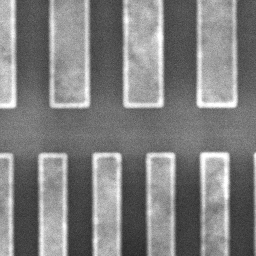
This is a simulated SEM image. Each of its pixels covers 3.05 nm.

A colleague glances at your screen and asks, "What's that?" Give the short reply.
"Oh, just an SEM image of groups of lines, slits or small figures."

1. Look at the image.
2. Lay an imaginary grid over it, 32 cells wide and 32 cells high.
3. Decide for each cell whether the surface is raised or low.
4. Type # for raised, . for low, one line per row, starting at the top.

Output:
##....#####.....####.....####...
##....#####.....####.....####...
##....#####.....####.....####...
##....#####.....####.....####...
##....#####.....####.....####...
##....#####.....####.....####...
##....#####.....####.....####...
##....#####.....####.....####...
##....#####.....####.....####...
##....#####.....####.....####...
##....#####.....####.....####...
##....#####.....####.....####...
##....#####.....####.....####...
................................
................................
................................
................................
................................
................................
#....###....###....##....###....
#....###....###....###...###....
#....###....###....###...###....
#....###....###....###...###....
#....###....###....###...###....
#....###....###....###...###....
#....###....###....###...###....
#....###....###....###...###....
#....###....###....###...###....
#....###....###....###...###....
##...###....###....###...###....
##...###....###....###...###....
##...###....###....###...###....